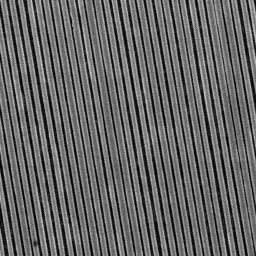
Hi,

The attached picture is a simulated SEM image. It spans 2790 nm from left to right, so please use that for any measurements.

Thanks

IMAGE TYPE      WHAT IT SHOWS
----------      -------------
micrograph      parallel lines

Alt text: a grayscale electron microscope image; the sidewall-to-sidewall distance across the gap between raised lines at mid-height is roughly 28.3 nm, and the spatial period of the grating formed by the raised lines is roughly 8.44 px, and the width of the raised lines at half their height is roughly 60.5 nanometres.